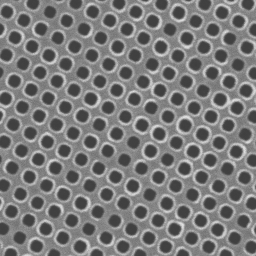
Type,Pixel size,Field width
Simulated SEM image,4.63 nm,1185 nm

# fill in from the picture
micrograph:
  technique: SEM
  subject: a regular array of holes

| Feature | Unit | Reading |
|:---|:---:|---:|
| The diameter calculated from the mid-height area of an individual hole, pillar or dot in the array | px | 12.3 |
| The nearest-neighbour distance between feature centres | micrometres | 0.0876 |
